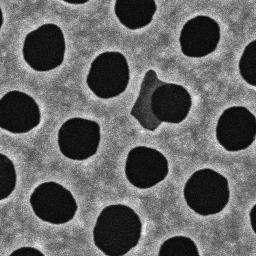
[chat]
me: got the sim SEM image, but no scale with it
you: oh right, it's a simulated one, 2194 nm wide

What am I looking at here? a regular array of holes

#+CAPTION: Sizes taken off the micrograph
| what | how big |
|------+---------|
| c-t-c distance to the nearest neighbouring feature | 0.581 um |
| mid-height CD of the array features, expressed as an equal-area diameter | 0.383 microns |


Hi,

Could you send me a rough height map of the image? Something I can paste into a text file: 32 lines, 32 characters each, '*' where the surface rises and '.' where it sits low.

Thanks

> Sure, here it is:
*********.****.....*************
**************.....*************
***************....*****...*****
*****..*********..*****....*****
***.....**************......****
***.....***************....****.
***.....*****..********...****..
***.....****....**************..
****...****.....**************..
***********.....**..**********..
***********.....**....*********.
*..*********...**.......********
....*************.......********
.....***********........*****..*
.....************......*****....
.....***....*****...*******.....
*..****......**************.....
*******......**************.....
*******.....*****..*********...*
.*******....****.....***********
..**************.....***********
..**************.....***...*****
..**************....***.....****
..**....*********..****......***
.***.....**************......***
****......*************.....****
****......***....*******...****.
*****....***......*************.
************......*************.
************......**************
************.....***....********
**...********...****.....*******